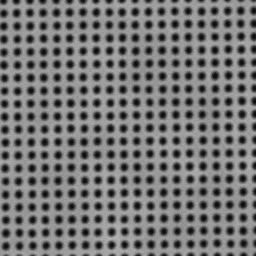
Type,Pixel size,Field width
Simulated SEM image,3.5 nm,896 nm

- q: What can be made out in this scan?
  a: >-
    a regular array of holes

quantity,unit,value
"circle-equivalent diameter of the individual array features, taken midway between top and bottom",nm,27.4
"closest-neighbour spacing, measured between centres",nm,44.6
